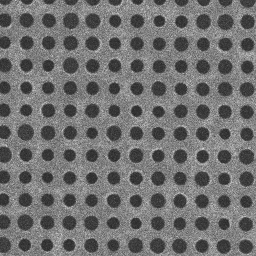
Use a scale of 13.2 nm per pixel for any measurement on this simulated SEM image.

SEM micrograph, a regular array of holes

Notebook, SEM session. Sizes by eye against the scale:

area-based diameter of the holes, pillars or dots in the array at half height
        175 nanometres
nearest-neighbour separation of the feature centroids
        290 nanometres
